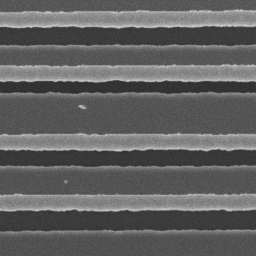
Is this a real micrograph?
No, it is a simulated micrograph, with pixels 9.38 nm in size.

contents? lines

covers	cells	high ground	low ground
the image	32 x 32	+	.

++++++++++++++++++++++++++++++++
++++++++++++++++++++++++++++++++
++++++++++++++++++++++++++++++++
................................
................................
................................
++++++++++++++++++++++++++++++++
++++++++++++++++++++++++++++++++
++++++++++++++++++++++++++++++++
++++++++++++++++++++++++++++++++
................................
................................
++++++++++++++++++++++++++++++++
++++++++++++++++++++++++++++++++
++++++++++++++++++++++++++++++++
++++++++++++++++++++++++++++++++
++++++++++++++++++++++++++++++++
++++++++++++++++++++++++++++++++
++++++++++++++++++++++++++++++++
................................
................................
++++++++++++++++++++++++++++++++
++++++++++++++++++++++++++++++++
++++++++++++++++++++++++++++++++
++++++++++++++++++++++++++++++++
++++++++++++++++++++++++++++++++
................................
................................
................................
++++++++++++++++++++++++++++++++
++++++++++++++++++++++++++++++++
++++++++++++++++++++++++++++++++